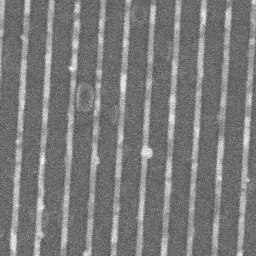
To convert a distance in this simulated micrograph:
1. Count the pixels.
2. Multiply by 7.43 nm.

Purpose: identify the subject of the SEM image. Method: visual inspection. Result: parallel lines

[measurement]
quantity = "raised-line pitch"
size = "187 nm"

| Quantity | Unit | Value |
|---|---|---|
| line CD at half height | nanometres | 33.4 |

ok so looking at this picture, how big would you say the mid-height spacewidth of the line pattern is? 155 nm